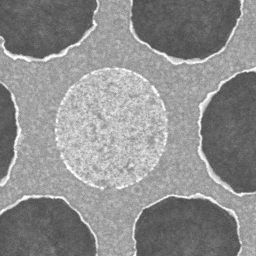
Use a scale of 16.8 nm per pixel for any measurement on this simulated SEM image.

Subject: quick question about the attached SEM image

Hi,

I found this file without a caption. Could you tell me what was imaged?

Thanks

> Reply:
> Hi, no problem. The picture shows holes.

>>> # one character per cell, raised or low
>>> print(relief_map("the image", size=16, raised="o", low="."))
......oo.......o
......oo.......o
.....oooo.....oo
o..ooooooo...ooo
ooooooooooooooo.
oooooooooooooo..
.oooooooooooo...
.oooooooooooo...
.oooooooooooo...
.oooooooooooo...
.oooooooooooo...
oooooooooooooo..
oo..oooooo...ooo
.....oooo......o
......oo.......o
......ooo......o